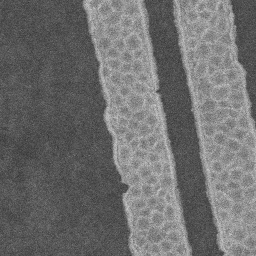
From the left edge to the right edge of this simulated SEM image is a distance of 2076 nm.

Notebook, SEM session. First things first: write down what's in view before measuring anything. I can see one or a few lines or trenches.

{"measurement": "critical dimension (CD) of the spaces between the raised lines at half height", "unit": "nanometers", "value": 297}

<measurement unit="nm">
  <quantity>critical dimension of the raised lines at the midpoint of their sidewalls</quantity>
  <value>405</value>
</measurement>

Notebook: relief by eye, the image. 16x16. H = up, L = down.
LLLLLLHHHLLHHHLL
LLLLLLHHHLLHHHLL
LLLLLLHHHLLHHHLL
LLLLLLHHHLLLHHHL
LLLLLLHHHHLLHHHL
LLLLLLLHHHLLHHHL
LLLLLLLHHHLLHHHL
LLLLLLLHHHLLHHHH
LLLLLLLHHHLLLHHH
LLLLLLLHHHLLLHHH
LLLLLLLHHHHLLHHH
LLLLLLLLHHHLLHHH
LLLLLLLLHHHLLHHH
LLLLLLLLHHHLLLHH
LLLLLLLLHHHLLLHH
LLLLLLLLHHHHLLHH